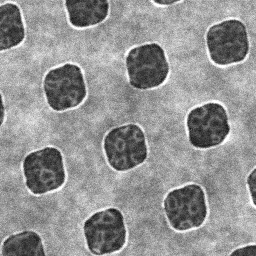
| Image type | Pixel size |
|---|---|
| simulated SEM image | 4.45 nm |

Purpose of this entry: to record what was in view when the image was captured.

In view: holes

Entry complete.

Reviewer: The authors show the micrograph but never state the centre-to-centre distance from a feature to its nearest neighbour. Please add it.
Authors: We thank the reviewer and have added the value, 84.6 px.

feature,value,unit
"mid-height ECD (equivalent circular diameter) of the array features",202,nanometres